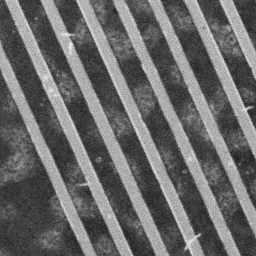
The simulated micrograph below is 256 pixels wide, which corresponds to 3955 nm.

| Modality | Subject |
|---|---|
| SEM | parallel lines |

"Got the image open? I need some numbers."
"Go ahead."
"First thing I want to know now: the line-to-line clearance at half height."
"0.348 microns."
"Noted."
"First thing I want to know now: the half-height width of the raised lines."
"153 nanometres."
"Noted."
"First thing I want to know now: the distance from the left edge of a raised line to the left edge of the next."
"0.504 microns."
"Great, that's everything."